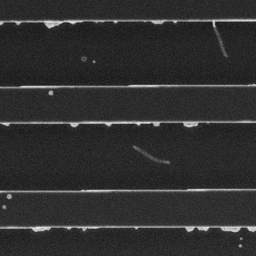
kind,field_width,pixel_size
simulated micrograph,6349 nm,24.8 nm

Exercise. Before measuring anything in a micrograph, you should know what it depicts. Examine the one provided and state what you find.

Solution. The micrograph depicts lines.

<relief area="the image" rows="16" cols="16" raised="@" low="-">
@@@@@@@@@@@@@@@@
----------------
----------------
----------------
----------------
@@@@@@@@@@@@@@@@
@@@@@@@@@@@@@@@@
@@@@@@@@@@@@@@@@
----------------
----------------
----------------
----------------
@@@@@@@@@@@@@@@@
@@@@@@@@@@@@@@@@
----------------
----------------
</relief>